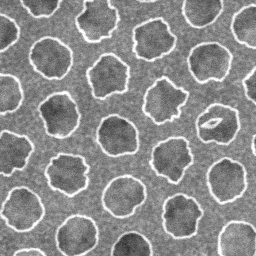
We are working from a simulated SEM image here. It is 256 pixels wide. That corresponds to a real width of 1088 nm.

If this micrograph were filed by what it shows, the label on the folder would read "a regular array of raised bodies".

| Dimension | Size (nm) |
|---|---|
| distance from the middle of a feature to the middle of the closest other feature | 246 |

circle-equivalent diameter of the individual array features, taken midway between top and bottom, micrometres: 0.175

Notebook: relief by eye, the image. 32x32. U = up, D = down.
DDDUUUUDDDDUUUDDDDDDDDDUUUUUDDDD
DDDDUUUDDDUUUUUDDDDDDDDUUUUUDDUU
UDDDDDDDDDUUUUUDDDDUDDDUUUUDDUUU
UUDDDDDDDDUUUUDDDUUUUDDDDDDDDUUU
UUDDDDDDDDDUUUDDDUUUUUDDDDDDDUUU
UDDDUUUUDDDDDDDDDUUUUUDDDUUDDDDU
DDDDUUUUUDDDDDDDDUUUUDDDUUUUUDDD
DDDDUUUUUDDDUUUDDDUDDDDDUUUUUDDD
DDDDUUUUUDDUUUUUDDDDDDDDUUUUUDDD
UDDDDUUUDDDUUUUUDDDDDDDDUUUUDDDU
UUDDDDDDDDDUUUUUDDDUUUDDDDDDDDDU
UUUDDDDDDDDDUUUDDDUUUUUDDDDDDDDU
UUUDDDUUUDDDDDDDDDUUUUUDDDDDDDDU
UUDDDUUUUUDDDDDDDDUUUUDDDDUUUDDD
DDDDDUUUUUDDDDUDDDDUUUDDDUUUUUDD
DDDDDDUUUUDDDUUUDDDDDDDDDUUUUUDD
UDDDDDUUUDDDUUUUUDDDDDDDDUUUUUDD
UUUUDDDDDDDDUUUUUDDDDUUDDUUUUDDD
UUUUDDDDDDDDDUUUUDDUUUUUDDDDDDDD
UUUUDDDUUUDDDDDDDDDUUUUUDDDDDDDD
UUUDDDUUUUUDDDDDDDDUUUUUDDDUUUDD
UUDDDDUUUUUDDDDDDDDDUUUDDDUUUUUD
DDDDDDUUUUUDDDUUUDDDDUDDDDUUUUUD
DDUDDDDUUUUDDUUUUUDDDDDDDDUUUUUD
DUUUUDDDDDDDDUUUUUDDDDUDDDDUUUDD
UUUUUDDDDDDDDUUUUUDDDUUUUDDDDDDD
UUUUUDDDDDDDDDUUUDDDUUUUUDDDDDDD
DUUUUDDDUUUDDDDDDDDDUUUUUDDDDDDD
DDUUDDDUUUUUDDDDDDDDDUUUUDDDUUUU
DDDDDDDUUUUUDDDUUUDDDDUUDDDUUUUU
DDDDDDDUUUUUDDUUUUUDDDDDDDDUUUUU
DDUUUDDDUUUDDDUUUUUDDDDDDDDUUUUU